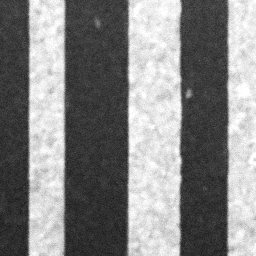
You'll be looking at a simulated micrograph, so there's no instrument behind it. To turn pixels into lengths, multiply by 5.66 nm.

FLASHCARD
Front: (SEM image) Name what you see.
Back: one or a few lines or trenches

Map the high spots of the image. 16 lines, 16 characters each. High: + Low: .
..++....+++...++
..++....+++...++
..++....+++...++
..++....+++...++
..++....+++...++
..++....+++...++
..++....+++...++
..++....+++...++
..++....+++...++
..++....+++...++
..++....+++...++
..++....+++...++
..++....+++...++
..++....+++...++
..++....+++...++
..++....+++...++